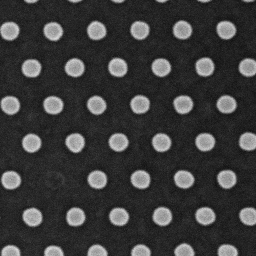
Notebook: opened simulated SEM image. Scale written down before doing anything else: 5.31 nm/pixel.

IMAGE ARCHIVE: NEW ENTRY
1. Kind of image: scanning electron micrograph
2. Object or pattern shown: a regular array of raised bodies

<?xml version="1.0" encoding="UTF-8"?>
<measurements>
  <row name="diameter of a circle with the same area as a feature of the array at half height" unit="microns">0.0936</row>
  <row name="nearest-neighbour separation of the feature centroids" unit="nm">227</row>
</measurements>